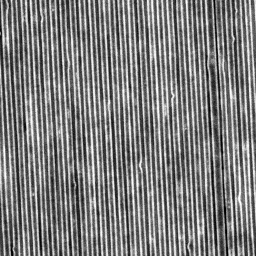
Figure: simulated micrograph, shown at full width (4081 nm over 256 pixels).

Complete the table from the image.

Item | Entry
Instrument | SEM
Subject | parallel lines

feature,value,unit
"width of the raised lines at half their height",93.5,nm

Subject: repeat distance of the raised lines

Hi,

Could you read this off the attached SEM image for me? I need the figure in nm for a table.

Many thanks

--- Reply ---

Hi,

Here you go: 155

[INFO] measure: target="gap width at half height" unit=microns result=0.0676